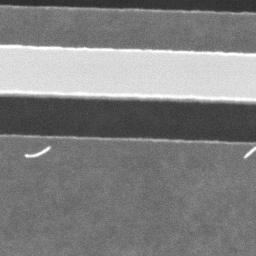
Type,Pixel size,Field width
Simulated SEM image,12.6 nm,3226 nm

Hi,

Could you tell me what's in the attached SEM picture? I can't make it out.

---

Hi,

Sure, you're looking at lines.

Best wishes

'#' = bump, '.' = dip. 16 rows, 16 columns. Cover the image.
####............
################
################
################
################
################
................
................
................
################
################
################
################
################
################
################